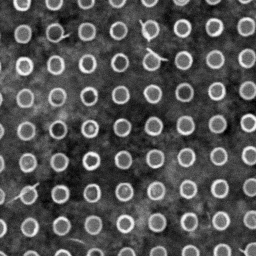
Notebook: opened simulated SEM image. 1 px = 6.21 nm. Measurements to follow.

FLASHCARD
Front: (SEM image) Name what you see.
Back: a regular array of raised bodies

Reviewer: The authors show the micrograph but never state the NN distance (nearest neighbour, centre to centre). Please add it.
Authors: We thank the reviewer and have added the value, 197 nanometers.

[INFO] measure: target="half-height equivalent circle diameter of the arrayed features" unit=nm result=108